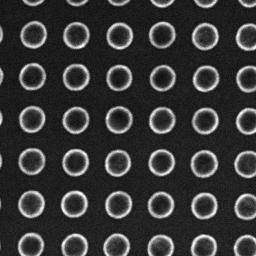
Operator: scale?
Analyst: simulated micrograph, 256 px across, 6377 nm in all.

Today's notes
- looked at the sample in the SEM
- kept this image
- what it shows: a regular array of raised bodies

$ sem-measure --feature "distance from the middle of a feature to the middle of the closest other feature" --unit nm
1050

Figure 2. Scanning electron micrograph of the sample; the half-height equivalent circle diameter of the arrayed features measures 0.607 micrometres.